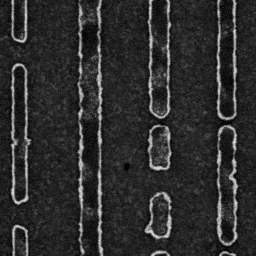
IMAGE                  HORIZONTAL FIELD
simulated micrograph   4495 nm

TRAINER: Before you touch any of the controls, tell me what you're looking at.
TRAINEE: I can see one or a few lines or trenches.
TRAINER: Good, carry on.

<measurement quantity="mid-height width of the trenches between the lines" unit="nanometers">891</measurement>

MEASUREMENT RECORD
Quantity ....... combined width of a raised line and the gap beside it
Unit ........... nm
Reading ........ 1210